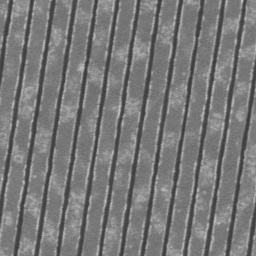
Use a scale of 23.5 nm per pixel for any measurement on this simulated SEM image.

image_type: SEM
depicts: parallel lines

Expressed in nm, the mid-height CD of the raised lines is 371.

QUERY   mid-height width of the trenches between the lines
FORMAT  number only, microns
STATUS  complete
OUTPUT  0.116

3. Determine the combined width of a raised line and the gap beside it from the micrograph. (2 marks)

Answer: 493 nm